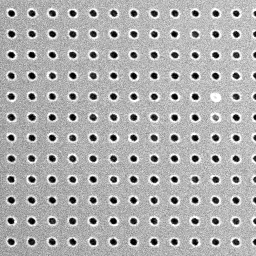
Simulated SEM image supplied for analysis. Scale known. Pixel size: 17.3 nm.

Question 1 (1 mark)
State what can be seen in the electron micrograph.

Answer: a regular array of holes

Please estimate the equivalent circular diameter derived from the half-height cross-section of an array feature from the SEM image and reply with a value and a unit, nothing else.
136 nm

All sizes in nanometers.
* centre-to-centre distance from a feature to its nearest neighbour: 350